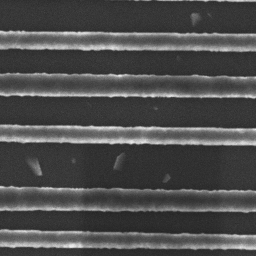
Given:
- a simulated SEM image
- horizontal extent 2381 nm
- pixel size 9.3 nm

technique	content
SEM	lines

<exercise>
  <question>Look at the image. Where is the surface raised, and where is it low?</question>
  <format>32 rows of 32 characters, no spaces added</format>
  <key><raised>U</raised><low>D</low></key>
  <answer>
DDDDDDDDDDDDDDDDDDDDDDDDDDDDDDDD
DDDDDDDDDDDDDDDDDDDDDDDDDDDDDDDD
DDDDDDDDDDDDDDDDDDDDDDDDDDDDDDDD
DDDDDDDDDDDDDDDDDDDDDDDDDDDDDDDD
UUUUUUUUUUUUUUUUUUUUUUUUUUUUUUUU
UUUUUUUUUUUUUUUUUUUUUUUUUUUUUUUU
DDDDDDDDDDDDDDDDDDDDDDDDDDDDDDDD
DDDDDDDDDDDDDDDDDDDDDDDDDDDDDDDD
DDDDDDDDDDDDDDDDDDDDDDDDDDDDDDDD
UUUUUUUUUUUUUUUUUUUUDDDDUDDDDDDD
UUUUUUUUUUUUUUUUUUUUUUUUUUUUUUUU
UUUUUUUUUUUUUUUUUUUUUUUUUUUUUUUU
DDDDDDDDDDDDDDDDDDDDDDDDDDDDDDDD
DDDDDDDDDDDDDDDDDDDDDDDDDDDDDDDD
DDDDDDDDDDDDDDDDDDDDDDDDDDDDDDDD
DDDDDDDDDDDDDDDDDDDDDDDDDDDDDDDD
UUUUUUUUUUUUUUUUUUUUUUUUUUUUUUUU
UUUUUUUUUUUUUUUUUUUUUUUUUUUUUUUU
DDDDDDDDDDDDDDDDDDDDDDDDDDDDDDDD
DDDDDDDDDDDDDDDDDDDDDDDDDDDDDDDD
DDDDDDDDDDDDDDDDDDDDDDDDDDDDDDDD
DDDDDDDDDDDDDDDDDDDDDDDDDDDDDDDD
DDDDDDDDDDDDDDDDDDDDDDDDDDDDDDDD
UUUUUUUDDDDDDDDDDDDDDDDDDDDDDDDD
UUUUUUUUUUUUUUUUUUUUUUUUUUUUUUUU
UUUUUUUUUUUUUUUUUUUUUUUUUUUUUUUU
DDDDDDDDDDDDDDDDDDDDDDDDDDDDDDUU
DDDDDDDDDDDDDDDDDDDDDDDDDDDDDDDD
DDDDDDDDDDDDDDDDDDDDDDDDDDDDDDDD
UUUUUUUUUUUUUUUUUUUUUUUUUUUUUUUU
UUUUUUUUUUUUUUUUUUUUUUUUUUUUUUUU
DDDDDDDDDDDDDDDDDDDDDDDDDDDDDDDD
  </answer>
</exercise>